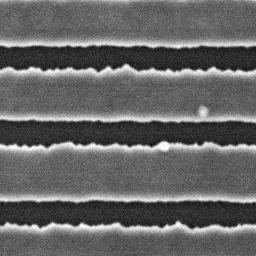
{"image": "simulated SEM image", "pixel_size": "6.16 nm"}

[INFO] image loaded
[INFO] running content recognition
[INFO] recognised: lines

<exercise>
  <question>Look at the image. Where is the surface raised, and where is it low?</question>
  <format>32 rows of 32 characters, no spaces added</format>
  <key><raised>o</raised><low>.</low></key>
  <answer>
oooooooooooooooooooooooooooooooo
oooooooooooooooooooooooooooooooo
oooooooooooooooooooooooooooooooo
oooooooooooooooooooooooooooooooo
oooooooooooooooooooooooooooooooo
oooooooooooooooooooooooooooooooo
................................
................................
...............o..........o.....
oooooooooooooooooooooooooooooooo
oooooooooooooooooooooooooooooooo
oooooooooooooooooooooooooooooooo
oooooooooooooooooooooooooooooooo
oooooooooooooooooooooooooooooooo
oooooooooooooooooooooooooooooooo
................................
................................
................................
oooooooooooooooooooooooooooooooo
oooooooooooooooooooooooooooooooo
oooooooooooooooooooooooooooooooo
oooooooooooooooooooooooooooooooo
oooooooooooooooooooooooooooooooo
oooooooooooooooooooooooooooooooo
oooooooooooooooooooooooooooooooo
................................
................................
................................
oooooooooooooooooooooooo.ooooooo
oooooooooooooooooooooooooooooooo
oooooooooooooooooooooooooooooooo
oooooooooooooooooooooooooooooooo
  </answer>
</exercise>